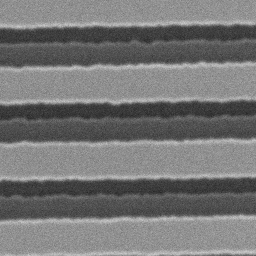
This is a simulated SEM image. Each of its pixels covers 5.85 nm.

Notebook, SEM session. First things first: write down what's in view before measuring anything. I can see lines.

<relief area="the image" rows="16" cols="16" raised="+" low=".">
++++++++++++++++
++++++++++++....
................
................
++++++++++++++++
++++++++++++++++
................
................
................
++++++++++++++++
++++++++++++++++
................
................
................
++++++++++++++++
++++++++++++++++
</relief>